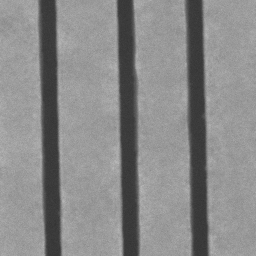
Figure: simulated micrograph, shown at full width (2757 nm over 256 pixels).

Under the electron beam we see lines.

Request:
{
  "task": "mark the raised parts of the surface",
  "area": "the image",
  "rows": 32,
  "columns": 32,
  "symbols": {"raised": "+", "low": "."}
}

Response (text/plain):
+++++..++++++++..++++++..+++++++
+++++..++++++++..++++++..+++++++
+++++..++++++++..++++++..+++++++
+++++..++++++++..++++++..+++++++
+++++..++++++++..++++++..+++++++
+++++..++++++++..++++++..+++++++
+++++..++++++++..++++++..+++++++
+++++..++++++++..++++++...++++++
+++++..++++++++..+++++++..++++++
+++++..++++++++..+++++++..++++++
+++++..++++++++..+++++++..++++++
+++++..++++++++..+++++++..++++++
+++++..++++++++..+++++++..++++++
+++++..++++++++..+++++++..++++++
+++++..++++++++..+++++++..++++++
+++++..++++++++..+++++++..++++++
+++++..++++++++..+++++++..++++++
+++++..++++++++..+++++++..++++++
+++++..++++++++..+++++++..++++++
+++++..++++++++..+++++++..++++++
+++++..++++++++..+++++++..++++++
+++++..++++++++..+++++++..++++++
+++++..++++++++..+++++++..++++++
+++++..++++++++..+++++++..++++++
+++++..++++++++..+++++++..++++++
+++++...+++++++..+++++++..++++++
++++++..+++++++..+++++++..++++++
++++++..+++++++..+++++++..++++++
++++++..+++++++..+++++++..++++++
++++++..+++++++..+++++++..++++++
++++++..+++++++..+++++++..++++++
++++++..+++++++..+++++++..++++++